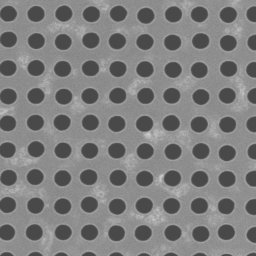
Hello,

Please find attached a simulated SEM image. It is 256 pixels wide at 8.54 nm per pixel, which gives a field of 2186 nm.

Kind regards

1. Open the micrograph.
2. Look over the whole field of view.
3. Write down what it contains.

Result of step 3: a regular array of holes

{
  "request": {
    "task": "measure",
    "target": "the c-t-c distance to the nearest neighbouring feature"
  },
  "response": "0.228 microns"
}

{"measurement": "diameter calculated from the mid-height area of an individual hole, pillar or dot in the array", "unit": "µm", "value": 0.141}